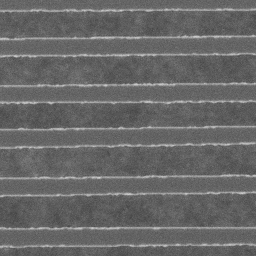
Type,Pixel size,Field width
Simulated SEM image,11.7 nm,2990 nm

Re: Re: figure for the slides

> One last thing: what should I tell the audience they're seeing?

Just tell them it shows lines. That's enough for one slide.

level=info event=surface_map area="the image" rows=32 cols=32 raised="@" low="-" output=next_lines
@@@@@@@@@@@@@@@@@@@@@@@@@@@@@@@@
--------------------------------
--------------------------------
--------------------------------
-------------------------------@
@@@@@@@@@@@@@@@@@@@@@@@@@@@@@@@@
@@@@@@@@@@@@@@@@@@@@@@@@@@@@@@@@
--------------------------------
--------------------------------
--------------------------------
-------------------------@--@@@@
@@@@@@@@@@@@@@@@@@@@@@@@@@@@@@@@
@@@@@@@@@@@@@@@@@@@@@@@@@@@@@@@@
--------------------------------
--------------------------------
--------------------------------
@@@@@@@@@@@@@@@@@@@@@@@@@@@@@@@@
@@@@@@@@@@@@@@@@@@@@@@@@@@@@@@@@
--------------------------------
--------------------------------
--------------------------------
--------------------------------
@@@@@@@@@@@@@@@@@@@@@@@@@@@@@@@@
@@@@@@@@@@@@@@@@@@@@@@@@@@@@@@@@
@-------------------------------
--------------------------------
--------------------------------
--------------------------------
--------------------------------
@@@@@@@@@@@@@@@@@@@@@@@@@@@@@@@@
@@@@@@@@@@@@@@@@@@@@@@@@@@@@@@-@
--------------------------------